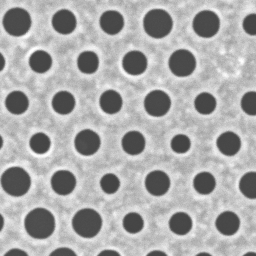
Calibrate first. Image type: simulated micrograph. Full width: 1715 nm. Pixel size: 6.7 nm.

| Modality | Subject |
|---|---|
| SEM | a regular array of holes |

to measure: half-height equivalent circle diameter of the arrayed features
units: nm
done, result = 166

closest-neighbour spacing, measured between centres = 0.308 um